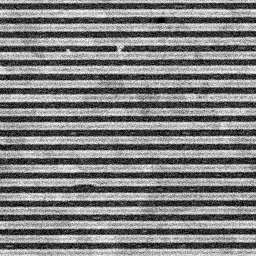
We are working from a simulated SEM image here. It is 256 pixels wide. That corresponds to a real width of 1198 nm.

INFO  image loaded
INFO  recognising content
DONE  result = parallel lines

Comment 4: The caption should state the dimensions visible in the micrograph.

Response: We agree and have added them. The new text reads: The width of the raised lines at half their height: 27.5 nm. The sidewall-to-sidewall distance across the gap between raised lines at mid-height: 36.8 nm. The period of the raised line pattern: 65.9 nm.